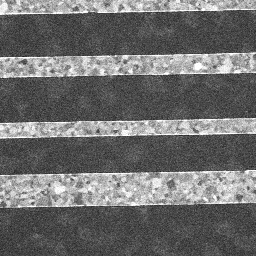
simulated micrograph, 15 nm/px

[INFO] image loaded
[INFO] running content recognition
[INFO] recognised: one or a few lines or trenches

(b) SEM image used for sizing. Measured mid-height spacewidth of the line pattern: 0.653 micrometres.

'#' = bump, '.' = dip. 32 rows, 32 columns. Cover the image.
################################
###########.###.................
................................
................................
................................
................................
......#.........................
################################
################################
#######......#..................
................................
................................
................................
................................
................................
################################
################################
................................
................................
................................
................................
.........................#######
################################
################################
################################
########################........
................................
................................
................................
................................
................................
................................